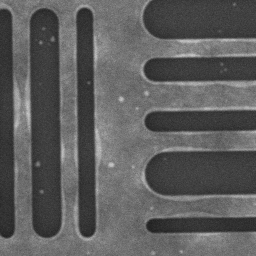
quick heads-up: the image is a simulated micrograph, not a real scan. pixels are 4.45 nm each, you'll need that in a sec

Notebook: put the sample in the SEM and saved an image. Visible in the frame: groups of lines, slits or small figures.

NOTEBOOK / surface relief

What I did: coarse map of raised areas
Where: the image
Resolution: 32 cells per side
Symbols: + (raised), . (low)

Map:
++++++++++++++++++..............
.+++...+++.+++++++..............
..++...++...++++++..............
..++...++...++++++..............
..++...++...+++++++.............
..++...++...++++++++++++++++++++
..++...++...++++++++++++++++++++
..++...++...+++++++.............
..++...++...++++++..............
..++....++..++++++..............
..+.....++..++++++++++++++++++++
..+.....++..++++++++++++++++++++
..+.....++..++++++++++++++++++++
..++....++..+++++++++++++++++..+
..++....++..++++++..............
..++....++..++++++..............
..++....++..+++++++............+
..++....++..++++++++++++++++++++
..++....++..++++++++++++++++++++
..++....++..+++++++.............
..++....++..++++++..............
..++....++..++++++..............
..++....++..++++++..............
..++....++..+++++++.............
..++....++..++++++++............
..++....++..++++++++++++++++++++
..++....++..++++++++++++++++++++
..++....++..+++++++.............
..++....++..++++++..............
..+++..+++..++++++++++++++++++++
++++++++++++++++++++++++++++++++
++++++++++++++++++++++++++++++++